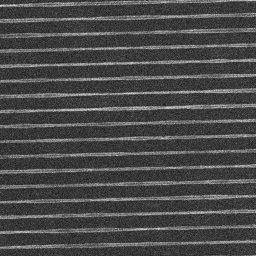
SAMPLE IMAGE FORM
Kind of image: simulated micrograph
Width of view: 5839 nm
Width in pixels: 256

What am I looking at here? parallel lines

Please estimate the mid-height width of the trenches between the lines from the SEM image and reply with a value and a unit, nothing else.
299 nm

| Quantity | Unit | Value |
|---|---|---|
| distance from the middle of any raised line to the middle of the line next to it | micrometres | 0.345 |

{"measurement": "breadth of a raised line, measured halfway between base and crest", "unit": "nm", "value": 59.9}